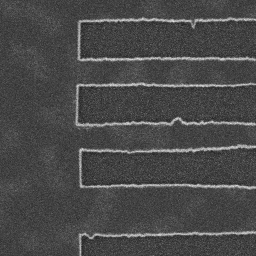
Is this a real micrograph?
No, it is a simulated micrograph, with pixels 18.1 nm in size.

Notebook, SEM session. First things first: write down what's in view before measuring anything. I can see one or a few lines or trenches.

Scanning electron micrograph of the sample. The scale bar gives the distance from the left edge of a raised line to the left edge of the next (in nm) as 1250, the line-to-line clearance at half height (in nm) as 695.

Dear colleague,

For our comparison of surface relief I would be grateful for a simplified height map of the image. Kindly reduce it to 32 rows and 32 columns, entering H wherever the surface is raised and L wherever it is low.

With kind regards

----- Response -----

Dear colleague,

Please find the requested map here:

HHHHHHHHHHHHHHHHHHHHHHHHHHHHHHHH
HHHHHHHHHHHHHHHHHHHHHHHHHHHHHHHH
HHHHHHHHHHHHHHHHLLLLHHHHHHHHLLLL
HHHHHHHHHHLLLLLLLLLLLLLLLLLLLLLL
HHHHHHHHHHLLLLLLLLLLLLLLLLLLLLLL
HHHHHHHHHHLLLLLLLLLLLLLLLLLLLLLL
HHHHHHHHHHLLLLLLLLLLLLLLLLLLLLLL
HHHHHHHHHHLHLHHHHHHHHHHHHHHHHHHH
HHHHHHHHHHHHHHHHHHHHHHHHHHHHHHHH
HHHHHHHHHHHHHHHHHHHHHHHHHHHHHHHH
HHHHHHHHHHHHHHHHHHHHHHHHHHHHHHHL
HHHHHHHHHHLLLLLLLLLLLLLLLLLLLLLL
HHHHHHHHHHLLLLLLLLLLLLLLLLLLLLLL
HHHHHHHHHHLLLLLLLLLLLLLLLLLLLLLL
HHHHHHHHHHLLLLLLLLLLLLLLLLLLLLLL
HHHHHHHHHHLLLHHHHHHHHHHHHHHHHHHL
HHHHHHHHHHHHHHHHHHHHHHHHHHHHHHHH
HHHHHHHHHHHHHHHHHHHHHHHHHHHHHHHH
HHHHHHHHHHHHHHHHHHHHHHHHHHHHLLLL
HHHHHHHHHHLLLLLLLLLLLLLLLLLLLLLL
HHHHHHHHHHLLLLLLLLLLLLLLLLLLLLLL
HHHHHHHHHHLLLLLLLLLLLLLLLLLLLLLL
HHHHHHHHHHLLLLLLLLLLLLLLLLLLLLLL
HHHHHHHHHHHHHHHHHHHHHHHHHHHHHHHL
HHHHHHHHHHHHHHHHHHHHHHHHHHHHHHHH
HHHHHHHHHHHHHHHHHHHHHHHHHHHHHHHH
HHHHHHHHHHHHHHHHHHHHHHHHHHHHHHHH
HHHHHHHHHHHHHHHHHHHHHHHHHHHHHHHH
HHHHHHHHHHHHHHHHHHHHHHHHHHHHHHHH
HHHHHHHHHHLHLLLLLLLLLLLLLLLLLLLL
HHHHHHHHHHLLLLLLLLLLLLLLLLLLLLLL
HHHHHHHHHHLLLLLLLLLLLLLLLLLLLLLL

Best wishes